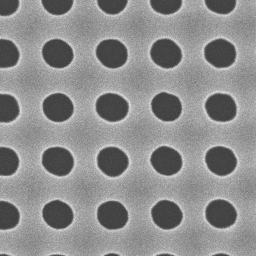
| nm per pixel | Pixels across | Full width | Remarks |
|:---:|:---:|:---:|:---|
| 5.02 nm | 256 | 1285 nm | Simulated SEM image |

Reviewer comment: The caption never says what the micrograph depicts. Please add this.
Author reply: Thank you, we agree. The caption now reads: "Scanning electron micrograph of a regular array of holes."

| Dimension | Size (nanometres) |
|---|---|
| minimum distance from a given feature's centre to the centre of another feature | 269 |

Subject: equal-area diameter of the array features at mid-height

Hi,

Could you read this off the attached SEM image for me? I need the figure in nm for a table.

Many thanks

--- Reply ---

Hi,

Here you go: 153